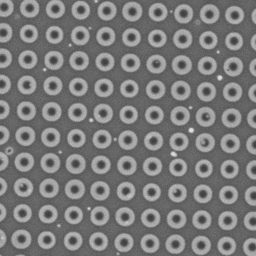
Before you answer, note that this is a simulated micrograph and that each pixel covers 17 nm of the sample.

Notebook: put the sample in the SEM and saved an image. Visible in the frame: an array of small figures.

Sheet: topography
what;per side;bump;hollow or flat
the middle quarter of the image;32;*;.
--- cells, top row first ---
..****..****..*****..****..*****
.........**....***...****..*****
.............................*..
................................
..***...****...***....**....**..
.*****..****..****...****..****.
..****..****..*****..****..*****
..***...****..****...****..****.
......................**....***.
................................
..***...***.....................
.*****..****..****...***...****.
.*****..****..****..*****..****.
..***...****..****...****..****.
.........**....**....***...****.
................................
..**............................
.****...***...****...***....**..
.****..*****..****..*****..****.
.****..*****..****..*****..****.
..**....***...****...***...****.
............................**..
...........................*....
.****...***...***....**.........
.****..****...****..****...***..
.****..****..*****..****..*****.
.****..****...****..****..*****.
...............**....**....***..
................................
.***....**......................
*****..****...***...***....***..
*****..****..*****..****..*****.